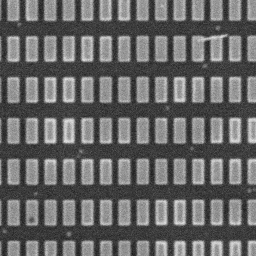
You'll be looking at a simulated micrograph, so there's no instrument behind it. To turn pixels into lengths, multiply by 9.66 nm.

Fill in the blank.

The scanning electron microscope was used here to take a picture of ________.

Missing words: groups of lines, slits or small figures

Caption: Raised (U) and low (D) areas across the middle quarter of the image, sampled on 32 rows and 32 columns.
DDDDDDDDDDDDDDDDDDDDDDDDDDDDDDDD
DDDDDDDDDDDDDDDDDDDDDDDDDDDDDDDD
DDDDDDDDDDDDDDDDDDDDDDDDDDDDDDDD
DDDDDDDDDUUDDDUUDDDUUDDUUDDDDDDD
UUDDDUUDDUUUDDUUDDUUUDDUUUDDUUDD
UUDDDUUDDUUUDDUUDDUUUDDUUUDDUUDD
UUDDDUUDDUUUDDUUDDUUUDDUUUDDUUDD
UUDDDUUDDUUUDDUUDDUUUDDUUUDDUUDD
UUDDDUUDDUUUDDUUDDUUUDDUUUDDUUDD
DDDDDUUDDUUDDDUUDDDUUDDUDDDDDDDD
DDDDDDDDDDDDDDDDDDDDDDDDDDDDDDDD
DDDDDDDDDDDDDDDDDDDDDDDDDDDDDDDD
DDDDDDDDDDDDDDDDDDDDDDDDDDDDDDDD
DDDDDDDDDDDDDDDDDDDDDDDDDDDDDDDD
UUDDDUUDDUUUDDUUDDUUUDDUUUDDUUDD
UUDDDUUDDUUUDDUUDDUUUDDUUUDDUUDD
UUDDDUUDDUUUDDUUDDUUUDDUUUDDUUDD
UUDDDUUDDUUUDDUUDDUUUDDUUUDDUUDD
UUDDDUUDDUUUDDUUDDUUUDDUUUDDUUDD
DUDDDUUDDUUUDDUUDDDUUDDUUUDDUUDD
DDDDDDDDDDDDDDDDDDDDDDDDDDDDDDDD
DDDDDDDDDDDDDDDDDDDDDDDDDDDDDDDD
DDDDDDDDDDDDDDDDDDDDDDDDDDDDDDDD
DDDDDDDDDDDDDDDDDDDDDDDDDDDDDDDD
UUDDDUUDDUUUDDUUDDUUUDDUUUDDUUDD
UUDDDUUDDUUUDDUUDDUUUDDUUUDDUUDD
UUDDDUUDDUUUDDUUDDUUUDDUUUDDUUDD
UUDDDUUDDUUUDDUUDDUUUDDUUUDDUUDD
UUDDDUUDDUUUDDUUDDUUUDDUUUDDUUDD
UUDDUUUDDUUUDDUUDDUUUDDUUUDDUUDD
DDDDDDDDDDDDDDDDDDDDDDDDDDDDDDDD
DDDDDDDDDDDDDDDDDDDDDDDDDDDDDDDD